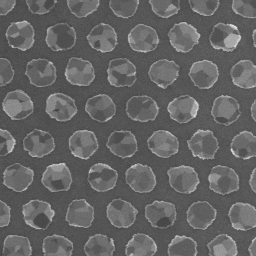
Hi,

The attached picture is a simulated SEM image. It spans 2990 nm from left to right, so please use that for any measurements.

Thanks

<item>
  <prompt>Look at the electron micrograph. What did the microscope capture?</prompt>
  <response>a regular array of raised bodies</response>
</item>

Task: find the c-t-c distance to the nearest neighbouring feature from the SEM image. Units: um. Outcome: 0.466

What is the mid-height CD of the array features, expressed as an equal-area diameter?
339 nm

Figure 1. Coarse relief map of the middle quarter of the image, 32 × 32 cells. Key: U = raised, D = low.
DUUUUUUDDDDUUUUUUDDDDDUUUUUUUDDD
DUUUUUUDDDDUUUUUUUDDDUUUUUUUUDDD
UUUUUUUDDDDUUUUUUUDDDUUUUUUUUDDU
DUUUUUUDDDDUUUUUUUDDDDUUUUUUDDDD
DUUUUUUDDDDUUUUUUDDDDDDUUUUDDDDD
DDDDDDDDDDDDDUDDUDDDDDDDUUDDDDDD
DDDDDDDDDDDDDDDDDDDDDDDDDDDDDDDD
DDDDDDDDDDDDDDDDDDDDDDDDDDDDDDDD
UUDDDDDUUUUDDDDDDUUUUUDDDDDDUUUU
UUUDDDUUUUUUDDDDUUUUUUUDDDDUUUUU
UUUDDUUUUUUUUDDDUUUUUUUDDDUUUUUU
UUUDDUUUUUUUUDDDUUUUUUUUDDUUUUUU
UUUDDDUUUUUUUDDDUUUUUUUDDDDUUUUU
UUDDDDDUUUUUDDDDDUUUUUUDDDDUUUUU
DDDDDDDDDUDDDDDDDDDDDDDDDDDDDUUD
DDDDDDDDDDDDDDDDDDDDDDDDDDDDDDDD
DDDDDDDDDDDDDDDDDDDDDDDDDDDDDDDD
DDUUUUUDDDDDUUUUUDDDDDUUUUUDDDDD
DDUUUUUUDDDUUUUUUUDDDUUUUUUUDDDD
DUUUUUUUDDDUUUUUUUDDDUUUUUUUUDDU
DDUUUUUUUDDUUUUUUUDDDUUUUUUUUDDU
DDUUUUUUDDDDUUUUUUDDDDUUUUUUDDDD
DDUUUUUDDDDDDUUUUDDDDDDUUUUUDDDD
DDDDUUDDDDDDDDDDDDDDDDDDDDDDDDDD
DDDDDDDDDDDDDDDDDDDDDDDDDDDDDDDD
UDDDDDDUUUUDDDDDDUUUDDDDDDDDDUDD
UDDDDDDUUUUUDDDDUUUUUUDDDDUUUUUU
UUDDDDUUUUUUUDDUUUUUUUDDDDUUUUUU
UUDDDDUUUUUUUDDDUUUUUUUDDDUUUUUU
UUDDDDUUUUUUUDDDUUUUUUUDDDUUUUUU
UDDDDDDUUUUUUDDDDUUUUUUDDDDUUUUU
UDDDDDDDUUUDDDDDDUUUUUDDDDDDUUUU